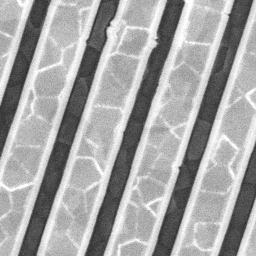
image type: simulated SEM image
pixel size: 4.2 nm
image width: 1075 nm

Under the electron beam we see one or a few lines or trenches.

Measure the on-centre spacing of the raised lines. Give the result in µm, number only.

0.267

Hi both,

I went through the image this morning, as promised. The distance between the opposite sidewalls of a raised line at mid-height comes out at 165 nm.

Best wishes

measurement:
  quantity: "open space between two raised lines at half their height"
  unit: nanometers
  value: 100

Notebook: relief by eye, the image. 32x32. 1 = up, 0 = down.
11110001111100011111000111111000
11100011111100011111000111110000
11100011111000011111000111110001
11100011111000111110000111110001
11000111111000111110001111100001
11000111110000111110001111100011
11000111110001111100001111100011
10000111110001111100011111000011
10001111100001111100011111000111
10001111100011111000011111000111
00001111100011111000111110000111
00011111000011111000111110001111
00011111000111110000111110001111
00011111000111110001111100001111
00111110000111110001111100011111
00111110001111100011111100011111
00111110001111100011111100011111
01111100001111100011111000011110
01111100011111000011111000111110
01111100011111000111111000111110
11111000011111000111110001111110
11111000111110000111110001111100
11111000111110001111110001111100
11111000111110001111100011111100
11110001111110001111100011111000
11110001111100011111100011111000
11110001111100011111000011111000
11100011111100011111000111110001
11100011111000111111000111110001
11100011111000111110000111110001
11000111111000111110001111100001
11000111110001111110001111100011